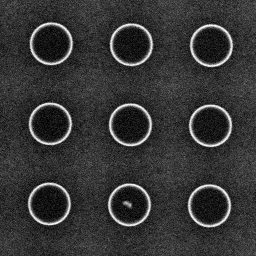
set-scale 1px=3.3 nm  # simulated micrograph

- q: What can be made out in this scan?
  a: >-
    an array of small figures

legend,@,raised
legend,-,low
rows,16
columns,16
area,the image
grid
----------------
----------------
--@@---@@---@@--
--@@---@@---@@--
----------------
----------------
----------------
--@@---@@---@@--
--@@---@@---@@--
----------------
----------------
----------------
--@@---@@---@@--
--@@---@@---@@--
----------------
----------------